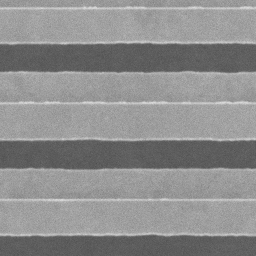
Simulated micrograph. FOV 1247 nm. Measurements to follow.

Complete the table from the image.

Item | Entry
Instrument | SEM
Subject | lines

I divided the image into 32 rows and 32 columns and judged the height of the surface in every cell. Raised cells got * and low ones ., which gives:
********************************
********************************
********************************
********************************
********************************
................................
................................
................................
................................
********************************
********************************
********************************
********************************
********************************
********************************
********************************
********************************
...**.........*.*..........***..
................................
................................
................................
********************************
********************************
********************************
********************************
********************************
********************************
********************************
********************************
................................
................................
................................